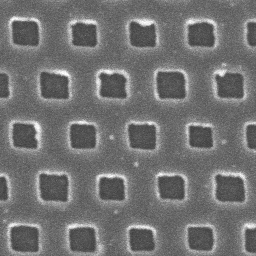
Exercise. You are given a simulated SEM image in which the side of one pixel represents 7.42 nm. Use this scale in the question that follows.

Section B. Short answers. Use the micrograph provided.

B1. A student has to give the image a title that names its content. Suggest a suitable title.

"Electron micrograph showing a regular array of holes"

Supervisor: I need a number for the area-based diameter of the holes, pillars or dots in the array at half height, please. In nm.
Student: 208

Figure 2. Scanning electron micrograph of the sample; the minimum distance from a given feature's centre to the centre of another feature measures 431 nm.